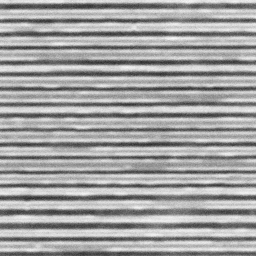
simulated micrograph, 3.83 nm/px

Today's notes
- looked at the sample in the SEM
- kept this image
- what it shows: parallel lines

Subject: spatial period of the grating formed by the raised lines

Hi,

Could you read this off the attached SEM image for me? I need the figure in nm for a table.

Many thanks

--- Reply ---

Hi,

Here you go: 52.3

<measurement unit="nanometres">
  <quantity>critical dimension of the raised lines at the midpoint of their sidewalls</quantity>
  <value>30.1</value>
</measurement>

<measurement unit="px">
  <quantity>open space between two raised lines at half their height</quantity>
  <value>5.74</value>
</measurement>